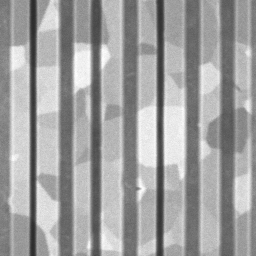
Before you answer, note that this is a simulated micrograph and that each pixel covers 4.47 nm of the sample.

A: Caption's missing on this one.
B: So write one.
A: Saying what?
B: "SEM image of parallel lines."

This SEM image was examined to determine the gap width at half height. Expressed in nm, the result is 66.5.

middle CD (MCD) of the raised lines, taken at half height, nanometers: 89.4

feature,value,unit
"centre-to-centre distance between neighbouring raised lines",0.141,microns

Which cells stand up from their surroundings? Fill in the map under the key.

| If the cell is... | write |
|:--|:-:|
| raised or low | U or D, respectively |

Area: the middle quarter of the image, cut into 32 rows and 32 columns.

DDDUUUUDDUUUUUDDDDDUUUUDDUUUUUDD
DDDUUUUDDUUUUUDDDDDUUUUDDUUUUUDD
DDDUUUUDDUUUUUDDDDDUUUUDDUUUUUDD
DDDUUUUDDUUUUUDDDDDUUUUDDUUUUUDD
DDUUUUUDDUUUUUDDDDDUUUUDDUUUUUDD
DDUUUUUDDUUUUUDDDDDUUUUDDUUUUUDD
DDUUUUUDDUUUUUDDDDDUUUUDDUUUUUDD
DDUUUUUDDUUUUUDDDDDUUUUDDUUUUUDD
DDUUUUUDDUUUUUDDDDDUUUUDDUUUUUDD
DDUUUUUDDUUUUUDDDDDUUUUDDUUUUUDD
DDUUUUUDDUUUUUDDDDDUUUUDDUUUUUDD
DDUUUUUDDUUUUUDDDDDUUUUDDUUUUUDD
DDUUUUUDDUUUUUDDDDDUUUUDDUUUUUDD
DDUUUUUDDUUUUUDDDDDUUUUDDUUUUUDD
DDUUUUUDDUUUUUDDDDDUUUUDDUUUUUDD
DDUUUUUDDUUUUUDDDDDUUUUDDUUUUUDD
DDUUUUUDDUUUUUDDDDDUUUUDDUUUUUDD
DDUUUUUDDUUUUUDDDDDUUUUDDUUUUUDD
DDUUUUUDDUUUUUDDDDDUUUUDDUUUUUDD
DDUUUUUDDUUUUUDDDDDUUUUDDUUUUUDD
DDUUUUUDDUUUUUDDDDDUUUUDDUUUUUDD
DDUUUUUDDUUUUUDDDDDUUUUDDUUUUUDD
DDUUUUUDDUUUUUDDDDDUUUUDDUUUUUDD
DDUUUUUDDUUUUUDDDDDUUUUDDUUUUUDD
DDUUUUUDDUUUUUDDDDDUUUUDDUUUUUDD
DDUUUUUDDUUUUUDDDDDUUUUDDUUUUUDD
DDUUUUUDDUUUUUDDDDDUUUUDDUUUUUDD
DDUUUUUDDUUUUUDDDDDUUUUDDUUUUUDD
DDUUUUUDDUUUUUDDDDDUUUUDDUUUUUDD
DDUUUUUDDUUUUUDDDDDUUUUDDUUUUUDD
DDUUUUUDDUUUUUDDDDDUUUUDDUUUUUDD
DDUUUUUDDUUUUUDDDDDUUUUDDUUUUUDD